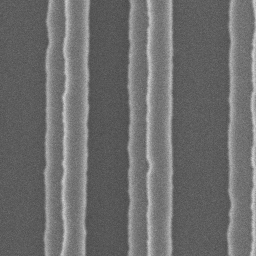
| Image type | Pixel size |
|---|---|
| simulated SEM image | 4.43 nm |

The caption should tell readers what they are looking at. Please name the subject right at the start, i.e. lines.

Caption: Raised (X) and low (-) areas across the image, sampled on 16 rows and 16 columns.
---XXX--XXX---XX
---XXX--XXX---XX
---XXX--XXX---XX
---XXX--XXX---XX
---XXX--XXX---XX
---XXX--XXX---XX
---XXX--XXX---XX
---XX---XXX---XX
---XX---XXX---XX
---XX---XXX---XX
---XX---XXX---XX
---XX---XXX---XX
---XX---XXX---XX
---XX---XXX---XX
---XX---XXX---XX
---XX---XXX---XX